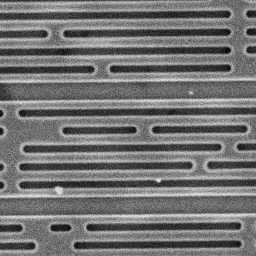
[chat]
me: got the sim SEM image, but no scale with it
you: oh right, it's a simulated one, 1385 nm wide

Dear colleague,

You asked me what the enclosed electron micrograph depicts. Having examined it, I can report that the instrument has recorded groups of lines, slits or small figures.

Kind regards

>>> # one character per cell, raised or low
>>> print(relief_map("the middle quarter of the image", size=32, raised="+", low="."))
.......+++++....................
........+++.....................
.......+++++++++++++++++++++++++
++++++++++++++++++++++++++++++++
................................
................................
................................
................................
................................
++++++++++++++++++++++++++++++++
++++++++++++++++++++++++++++++++
................................
................................
++++++++++++++++++++++++++++++++
++++++++++++++++++++++++++++++++
+++++++++++++++++++++++.........
..................++++..........
..................+++++.........
++++++++++++++++++++++++++++++++
++++++++++++++++++++++++++++++++
................................
................................
++++++++++++++++++++++++++++++++
++++++++++++++++++++++++++++++++
+++++...........................
................................
................................
++++++++++++++++++++++++++++++++
+++++++++++++++++++++++++++++++.
................................
................................
++++++++++++++++++++++++++++++++